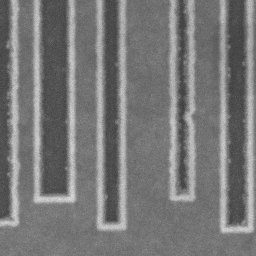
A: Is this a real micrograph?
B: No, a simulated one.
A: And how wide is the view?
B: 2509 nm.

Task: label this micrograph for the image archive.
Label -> one or a few lines or trenches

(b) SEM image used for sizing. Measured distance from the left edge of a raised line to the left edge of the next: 0.593 µm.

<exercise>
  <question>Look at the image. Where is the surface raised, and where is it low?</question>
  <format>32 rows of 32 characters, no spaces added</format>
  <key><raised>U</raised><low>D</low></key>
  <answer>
DDUUUDDDDUUUDDDUUUUUUUDDUUUUDDDU
DDUUUDDDDUUUDDDUUUUUUUDDUUUUDDDU
DDUUUDDDDUUUDDDUUUUUUUDDUUUUDDDU
DDUUUDDDDUUUDDDUUUUUUUDDUUUUDDDU
DDUUUDDDDUUUDDDUUUUUUUDDUUUUDDDU
DDUUUDDDDUUUDDDUUUUUUUDDUUUUDDDU
DDUUUDDDDUUUDDDUUUUUUUDDUUUUDDDU
DDUUUDDDDUUUDDDUUUUUUUDDUUUUDDDU
DDUUUDDDDUUUUDDUUUUUUUDDUUUUDDDU
DDUUUDDDDUUUDDDUUUUUUUDDUUUUDDDU
DDUUUDDDDUUUDDDUUUUUUUDDUUUUDDDU
DDUUUDDDDUUUUDDUUUUUUUDDUUUUDDDU
DDUUUDDDDUUUUDDUUUUUUUDDUUUUDDDU
DDUUUDDDDUUUUDDUUUUUUUDDUUUUDDDU
DDUUUDDDDUUUUDDUUUUUUUDDUUUUDDDU
DDUUUDDDDUUUDDDUUUUUUUDDUUUUDDDU
DDUUUDDDDUUUUDDUUUUUUUDDUUUUDDDU
DDUUUDDDDUUUDDDUUUUUUUDDUUUUDDDU
DDUUUDDDDUUUDDDUUUUUUUDDUUUUDDDU
DDUUUDDDDUUUDDDUUUUUUUDDUUUUDDDU
DDUUUDDDDUUUDDDUUUUUUUDDUUUUDDDU
DDUUUDDDDUUUDDDUUUUUUUDDUUUUDDDU
DDUUUDDDDUUUDDDUUUUUUUDDUUUUDDDU
DDUUUDDDDUUUDDDUUUUUUUDDUUUUDDDU
DDUUUDDDDUUUUDDUUUUUUUDDUUUUDDDU
DDUUUUUUUUUUDDDUUUUUUUUUUUUUDDDU
DDUUUUUUUUUUDDDUUUUUUUUUUUUUDDDU
DDUUUUUUUUUUDDDUUUUUUUUUUUUUDDDU
UUUUUUUUUUUUUUUUUUUUUUUUUUUUDDDU
UUUUUUUUUUUUUUUUUUUUUUUUUUUUUUUU
UUUUUUUUUUUUUUUUUUUUUUUUUUUUUUUU
UUUUUUUUUUUUUUUUUUUUUUUUUUUUUUUU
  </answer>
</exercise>